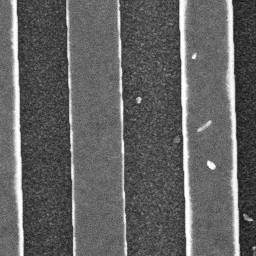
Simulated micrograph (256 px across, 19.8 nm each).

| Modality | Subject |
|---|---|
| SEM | lines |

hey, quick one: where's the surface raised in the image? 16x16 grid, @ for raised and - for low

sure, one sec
@---@@@----@@@--
@---@@@----@@@@-
@---@@@@---@@@@-
@---@@@@---@@@@-
@---@@@@---@@@@-
@---@@@@---@@@@-
@---@@@@---@@@@-
@---@@@@---@@@@-
@---@@@@----@@@-
@----@@@----@@@-
@----@@@----@@@-
@----@@@----@@@-
@----@@@----@@@-
@----@@@----@@@-
@----@@@----@@@-
@----@@@----@@@-